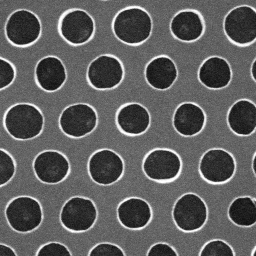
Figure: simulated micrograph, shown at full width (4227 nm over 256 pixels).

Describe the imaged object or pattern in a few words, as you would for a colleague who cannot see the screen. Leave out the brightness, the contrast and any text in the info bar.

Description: a regular array of holes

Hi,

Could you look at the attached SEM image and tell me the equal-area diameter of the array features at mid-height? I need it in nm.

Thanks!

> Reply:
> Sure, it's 564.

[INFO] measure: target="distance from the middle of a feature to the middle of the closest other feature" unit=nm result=885